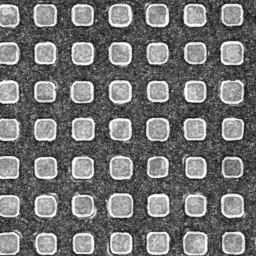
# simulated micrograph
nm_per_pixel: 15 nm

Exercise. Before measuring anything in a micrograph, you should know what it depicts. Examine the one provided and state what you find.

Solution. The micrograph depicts a regular array of raised bodies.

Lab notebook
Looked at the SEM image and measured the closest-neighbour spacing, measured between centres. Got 558 nm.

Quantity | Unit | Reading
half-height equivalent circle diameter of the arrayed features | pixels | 22.3